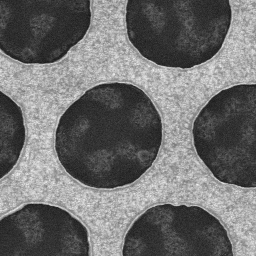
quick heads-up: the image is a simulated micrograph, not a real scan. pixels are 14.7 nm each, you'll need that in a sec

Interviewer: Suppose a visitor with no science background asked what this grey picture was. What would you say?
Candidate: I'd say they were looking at holes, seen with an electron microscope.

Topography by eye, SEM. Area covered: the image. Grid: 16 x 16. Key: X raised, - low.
------XX------XX
------XX------XX
-----XXX------XX
X---XXXXX----XXX
XXXXXXXXXXXXXXXX
XXXXXX---XXXXX--
-XXXX-----XXX---
-XXX------XX----
--X-------XX----
-XXX------XX----
-XXX-----XXXX---
XXXXX---XXXXXX--
XXXXXXXXXXXXXXXX
-----XXXX----XXX
-----XXX------XX
------XX-------X